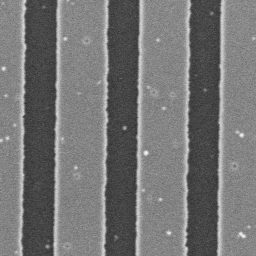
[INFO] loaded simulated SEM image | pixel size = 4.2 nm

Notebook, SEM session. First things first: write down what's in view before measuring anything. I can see lines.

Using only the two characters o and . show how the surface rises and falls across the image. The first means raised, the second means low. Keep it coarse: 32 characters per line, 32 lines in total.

ooo....oooooo....ooooooo....oooo
ooo....oooooo....ooooooo....oooo
ooo....oooooo....ooooooo....oooo
ooo....oooooo....ooooooo....oooo
ooo....oooooo....ooooooo....oooo
ooo....oooooo....ooooooo....oooo
ooo....oooooo....ooooooo....oooo
ooo....oooooo....ooooooo....oooo
ooo....ooooooo...ooooooo...ooooo
ooo....oooooo....ooooooo....oooo
ooo....oooooo....ooooooo...ooooo
ooo....oooooo....ooooooo...ooooo
ooo....oooooo....ooooooo...ooooo
ooo....oooooo....ooooooo...ooooo
ooo....oooooo....oooooo....ooooo
ooo....oooooo....oooooo....ooooo
ooo....oooooo....oooooo....ooooo
ooo....oooooo....ooooooo...ooooo
ooo....oooooo....ooooooo...ooooo
ooo....oooooo....oooooo....ooooo
ooo....oooooo....oooooo....ooooo
ooo....oooooo....oooooo....ooooo
ooo....oooooo....oooooo....ooooo
ooo....oooooo....oooooo....ooooo
ooo....oooooo....oooooo....ooooo
ooo....oooooo....oooooo....ooooo
ooo....oooooo....oooooo....ooooo
ooo....oooooo....oooooo....ooooo
ooo....oooooo....oooooo....ooooo
ooo....oooooo....oooooo....ooooo
ooo....oooooo....oooooo....ooooo
ooo....oooooo....oooooo....ooooo